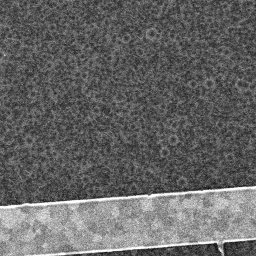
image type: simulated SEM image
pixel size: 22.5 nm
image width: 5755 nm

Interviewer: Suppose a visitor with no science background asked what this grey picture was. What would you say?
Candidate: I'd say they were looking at one or a few lines or trenches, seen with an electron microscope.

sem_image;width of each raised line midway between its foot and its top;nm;1150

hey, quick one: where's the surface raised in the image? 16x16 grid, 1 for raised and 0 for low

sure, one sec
0000000000000000
0000000000000000
0000000000000000
0000000000000000
0000000000000000
0000000000000000
0000000000000000
0000000000000000
0000000000000000
0000000000000000
0000000000000000
0000000000000000
0000001111111111
1111111111111111
1111111111111111
1111111110000000